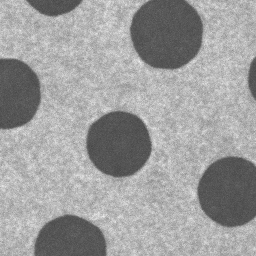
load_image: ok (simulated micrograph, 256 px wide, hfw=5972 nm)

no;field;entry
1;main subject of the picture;holes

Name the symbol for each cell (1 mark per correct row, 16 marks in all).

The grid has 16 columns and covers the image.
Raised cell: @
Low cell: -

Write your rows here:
@@---@@@@---@@@@
@@@@@@@@-----@@@
@@@@@@@@-----@@@
@@@@@@@@@---@@@@
--@@@@@@@@@@@@@@
---@@@@@@@@@@@@@
--@@@@@@@@@@@@@@
--@@@@---@@@@@@@
@@@@@----@@@@@@@
@@@@@----@@@@@@@
@@@@@@---@@@@---
@@@@@@@@@@@@----
@@@@@@@@@@@@----
@@@@-@@@@@@@@---
@@----@@@@@@@@@@
@@-----@@@@@@@@@